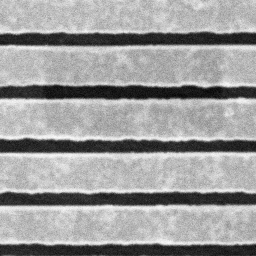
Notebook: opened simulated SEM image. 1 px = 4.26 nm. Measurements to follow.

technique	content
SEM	lines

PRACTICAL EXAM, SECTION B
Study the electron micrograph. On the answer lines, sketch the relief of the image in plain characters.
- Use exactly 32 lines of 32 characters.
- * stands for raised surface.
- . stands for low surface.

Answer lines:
********************************
********************************
********************************
********************************
................................
................................
********************************
********************************
********************************
********************************
****.*******.***.******.********
................................
................................
********************************
********************************
********************************
********************************
................................
................................
********************************
********************************
********************************
********************************
********************************
................................
................................
********************************
********************************
********************************
********************************
.......................*....*...
................................